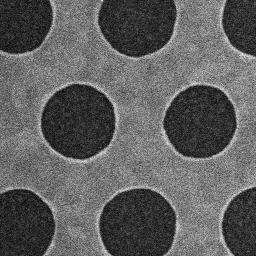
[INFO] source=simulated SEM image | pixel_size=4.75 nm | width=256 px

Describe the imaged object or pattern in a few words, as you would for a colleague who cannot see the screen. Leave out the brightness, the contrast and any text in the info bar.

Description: holes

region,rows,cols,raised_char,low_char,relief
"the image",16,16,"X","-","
---XXX-----XXX--
---XXX-----XXX--
---XXXX----XXX--
XXXXXXXX-XXXXXXX
XXXXXXXXXXXXXXXX
XXXX--XXXXXX--XX
XXX----XXXX---XX
XXX----XXX-----X
XXX----XXX-----X
XXXX--XXXXX---XX
XXXXXXXXXXXXXXXX
XXXXXXXXXXXXXXXX
---XXXX---XXXX--
---XXX-----XXX--
---XXX-----XXX--
---XXXX----XXX--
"